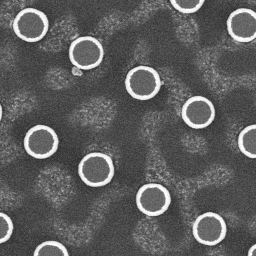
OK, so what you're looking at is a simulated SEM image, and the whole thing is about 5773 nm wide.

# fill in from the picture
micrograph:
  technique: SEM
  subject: a regular array of raised bodies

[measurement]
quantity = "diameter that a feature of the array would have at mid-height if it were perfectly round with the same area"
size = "696 nm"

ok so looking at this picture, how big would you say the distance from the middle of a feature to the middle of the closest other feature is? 1410 nm